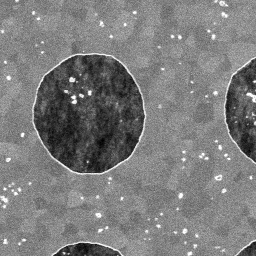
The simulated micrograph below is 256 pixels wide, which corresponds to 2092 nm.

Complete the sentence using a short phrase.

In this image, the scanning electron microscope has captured holes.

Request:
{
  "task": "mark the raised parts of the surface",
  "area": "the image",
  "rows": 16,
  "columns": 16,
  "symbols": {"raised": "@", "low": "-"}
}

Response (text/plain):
@@@@@@@@@@@@@@@@
@@@@@@@@@@@@@@@@
@@@@@@@@@@@@@@@@
@@@@@--@@@@@@@@@
@@@-----@@@@@@@-
@@-------@@@@@--
@@-------@@@@@--
@@-------@@@@@--
@@-------@@@@@--
@@@-----@@@@@@@-
@@@@---@@@@@@@@@
@@@@@@@@@@@@@@@@
@@@@@@@@@@@@@@@@
@@@@@@@@@@@@@@@@
@@@@@@@@@@@@@@@@
@@@@---@@@@@@@@-